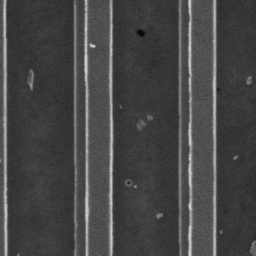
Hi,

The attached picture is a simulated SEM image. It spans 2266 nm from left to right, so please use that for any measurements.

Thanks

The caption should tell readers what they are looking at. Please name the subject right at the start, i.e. lines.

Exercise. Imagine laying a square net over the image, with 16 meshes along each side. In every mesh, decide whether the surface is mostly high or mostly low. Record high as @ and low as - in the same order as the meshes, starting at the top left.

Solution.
-----@@----@@---
-----@@----@@---
-----@@----@@---
-----@@----@@---
-----@@----@@---
-----@@----@@---
-----@@----@@---
-----@@----@@---
-----@@----@@---
-----@@----@@---
-----@@----@@---
-----@@----@@---
-----@@----@@---
-----@@----@@---
-----@@----@@---
-----@@----@@---